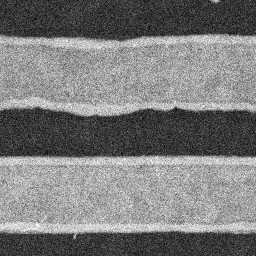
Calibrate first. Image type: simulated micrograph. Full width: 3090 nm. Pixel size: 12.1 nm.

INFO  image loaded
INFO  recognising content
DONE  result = one or a few lines or trenches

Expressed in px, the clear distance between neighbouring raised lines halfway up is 54.6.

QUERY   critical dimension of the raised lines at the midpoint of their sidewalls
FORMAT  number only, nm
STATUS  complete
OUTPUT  800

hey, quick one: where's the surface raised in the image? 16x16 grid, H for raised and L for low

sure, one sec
LLLLLLLLLLLLLLLL
LLLLLLLLLLLLLLLL
LLLLLLLLLLLHHHHL
HHHHHHHHHHHHHHHH
HHHHHHHHHHHHHHHH
HHHHHHHHHHHHHHHH
LLLHHHHHHHHHHHHH
LLLLLLLLLLLLLLLL
LLLLLLLLLLLLLLLL
LLLLLLLLLLLLLLLL
HHHHHHHHHHHHHHHH
HHHHHHHHHHHHHHHH
HHHHHHHHHHHHHHHH
HHHHHHHHHHHHHHHH
LLLLLLLLLLLLLLLL
LLLLLLLLLLLLLLLL